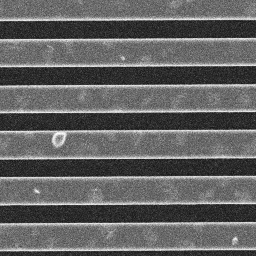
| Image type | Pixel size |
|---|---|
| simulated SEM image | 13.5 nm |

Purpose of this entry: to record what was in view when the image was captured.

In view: parallel lines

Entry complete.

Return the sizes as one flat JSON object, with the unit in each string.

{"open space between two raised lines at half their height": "0.252 micrometres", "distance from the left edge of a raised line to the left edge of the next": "622 nm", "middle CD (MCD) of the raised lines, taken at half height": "373 nm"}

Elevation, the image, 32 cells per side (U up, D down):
UUUUUUUUUUUUUUUUUUUUUUUUUUUUUUUU
UUUUUUUUUUUUUUUUUUUUUUUUUUUUUUUU
UUUUUUUUDDDDDDDDDDDDDDDDDDDDDDDD
DDDDDDDDDDDDDDDDDDDDDDDDDDDDDDDD
DDDDDDDDDDDDDDDDDDDDDDDDDDDDDDDD
UUUUUUUUUUUUUUUUUUUUUUUUUUUUUUUU
UUUUUUUUUUUUUUUUUUUUUUUUUUUUUUUU
UUUUUUUUUUUUUUUUUUUUUUUUUUUUUUUU
DDDDDDDDDDDDDDDDDDDDDDDDDDDDDDDD
DDDDDDDDDDDDDDDDDDDDDDDDDDDDDDDD
DDDDDDDDDDDDDDDDDDDDDDDDDDDDDDDD
UUUUUUUUUUUUUUUUUUUUUUUUUUUUUUUU
UUUUUUUUUUUUUUUUUUUUUUUUUUUUUUUU
UUUUUUUUUUUUUUUUUUUUUUUUUUUUUUUU
DDDDDDDDDDDDDDDDDDDDDDDDDDDDDDDD
DDDDDDDDDDDDDDDDDDDDDDDDDDDDDDDD
UUUUUUUUUUUUUUUUUUUUUUUUUUUUUUUU
UUUUUUUUUUUUUUUUUUUUUUUUUUUUUUUU
UUUUUUUUUUUUUUUUUUUUUUUUUUUUUUUU
UUUUUUUUUUUUUUUUUUUUUUUUUUUUUUUU
DDDDDDDDDDDDDDDDDDDDDDDDDDDDDDDD
DDDDDDDDDDDDDDDDDDDDDDDDDDDDDDDD
UUUUUUUUUUUUUUUUUUUUUUUUUUUUUUUU
UUUUUUUUUUUUUUUUUUUUUUUUUUUUUUUU
UUUUUUUUUUUUUUUUUUUUUUUUUUUUUUUU
UUUUUUUUDDDDDDDDDDDDDDDDDDDDDDDD
DDDDDDDDDDDDDDDDDDDDDDDDDDDDDDDD
DDDDDDDDDDDDDDDDDDDDDDDDDDDDDDDD
UUUUUUUUUUUUUUUUUUUUUUUUUUUUUUUU
UUUUUUUUUUUUUUUUUUUUUUUUUUUUUUUU
UUUUUUUUUUUUUUUUUUUUUUUUUUUUUUUU
DDDDDDDDDDDDDDDDDDDDDDDDDDDDDDDD